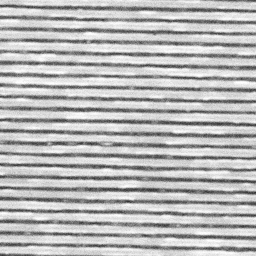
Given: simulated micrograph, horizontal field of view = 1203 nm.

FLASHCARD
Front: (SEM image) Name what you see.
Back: parallel lines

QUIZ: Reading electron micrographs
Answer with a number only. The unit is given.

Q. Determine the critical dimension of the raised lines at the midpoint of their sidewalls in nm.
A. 31.7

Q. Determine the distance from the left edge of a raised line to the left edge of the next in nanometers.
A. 53.2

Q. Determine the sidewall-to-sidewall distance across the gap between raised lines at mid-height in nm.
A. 21.1